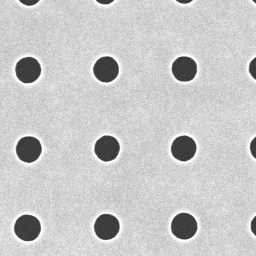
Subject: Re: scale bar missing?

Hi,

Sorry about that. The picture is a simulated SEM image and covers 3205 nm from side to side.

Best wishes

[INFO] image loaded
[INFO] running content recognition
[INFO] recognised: a regular array of holes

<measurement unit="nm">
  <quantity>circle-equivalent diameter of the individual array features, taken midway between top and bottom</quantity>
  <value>329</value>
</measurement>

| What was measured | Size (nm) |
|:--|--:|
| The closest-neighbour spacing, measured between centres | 970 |